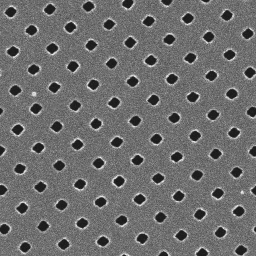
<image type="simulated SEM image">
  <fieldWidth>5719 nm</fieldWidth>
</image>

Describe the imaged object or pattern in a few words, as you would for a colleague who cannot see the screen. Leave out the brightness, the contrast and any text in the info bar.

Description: a regular array of holes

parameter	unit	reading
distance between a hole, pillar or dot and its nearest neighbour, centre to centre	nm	613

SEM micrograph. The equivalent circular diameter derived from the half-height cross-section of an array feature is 235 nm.